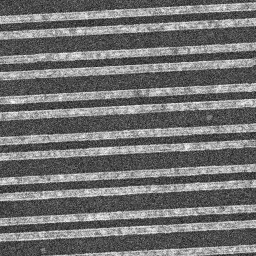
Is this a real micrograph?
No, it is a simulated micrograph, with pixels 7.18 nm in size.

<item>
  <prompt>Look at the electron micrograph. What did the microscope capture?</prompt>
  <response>parallel lines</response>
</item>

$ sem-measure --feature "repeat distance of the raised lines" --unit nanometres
142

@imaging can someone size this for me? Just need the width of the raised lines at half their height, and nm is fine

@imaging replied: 50.2